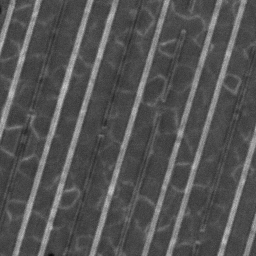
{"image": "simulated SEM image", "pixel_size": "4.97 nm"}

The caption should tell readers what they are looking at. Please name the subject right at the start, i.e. parallel lines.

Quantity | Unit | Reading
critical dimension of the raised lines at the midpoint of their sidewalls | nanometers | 17.9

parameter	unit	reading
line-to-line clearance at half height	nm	103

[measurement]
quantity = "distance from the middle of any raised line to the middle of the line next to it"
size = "0.122 micrometres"